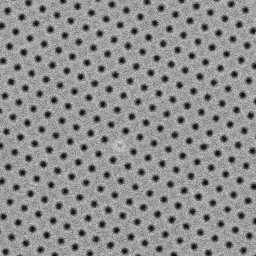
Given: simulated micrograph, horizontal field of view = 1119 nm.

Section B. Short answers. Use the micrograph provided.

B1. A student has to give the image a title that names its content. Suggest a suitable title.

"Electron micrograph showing a regular array of holes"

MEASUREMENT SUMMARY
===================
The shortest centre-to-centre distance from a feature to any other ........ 0.067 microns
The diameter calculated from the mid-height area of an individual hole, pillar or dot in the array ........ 28.8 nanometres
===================